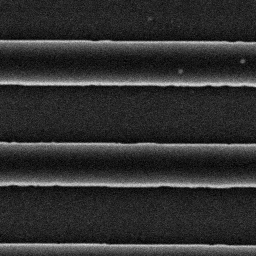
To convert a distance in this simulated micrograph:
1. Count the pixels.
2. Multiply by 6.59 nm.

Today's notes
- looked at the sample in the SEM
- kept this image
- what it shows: lines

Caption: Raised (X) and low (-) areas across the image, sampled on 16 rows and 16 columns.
----------------
----------------
----------------
XXXXXXXXXXXXXXXX
XXXXXXXXXXXXXXXX
----------------
----------------
----------------
----------------
XXXXXXXXXXXXXXXX
XXXXXXXXXXXXXXXX
XXXXXXXXXXXXXXXX
----------------
----------------
----------------
XXXXXXXXXXXXXXXX